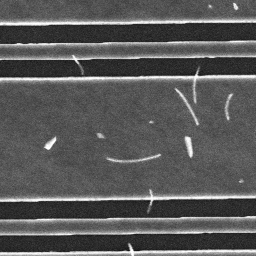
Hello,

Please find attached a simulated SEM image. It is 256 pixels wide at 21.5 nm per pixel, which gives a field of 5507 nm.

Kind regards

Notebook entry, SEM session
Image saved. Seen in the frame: lines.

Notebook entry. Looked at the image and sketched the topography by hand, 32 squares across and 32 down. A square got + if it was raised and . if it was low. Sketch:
++++++++++++++++++++++++++++++++
++++++++++++++++++++++++++++++++
++++++++++++++++++++++++++++++++
................................
................................
..++++++++++++++++++++++++++++++
++++++++++++++++++++++++++++++++
.........+......................
................................
........................+.......
++++++++++++++++++++++++++++++++
++++++++++++++++++++++++++++++++
++++++++++++++++++++++++++++++++
++++++++++++++++++++++++++++++++
++++++++++++++++++++++++++++++++
++++++++++++++++++++++++++++++++
++++++++++++++++++++++++++++++++
++++++++++++++++++++++++++++++++
++++++++++++++++++++++++++++++++
++++++++++++++++++++++++++++++++
++++++++++++++++++++++++++++++++
++++++++++++++++++++++++++++++++
++++++++++++++++++++++++++++++++
++++++++++++++++++++++++++++++++
++++++++++++++++++++++++++++++++
................................
................................
....++++++++++++++++++++++++++++
++++++++++++++++++++++++++++++++
................................
................................
...........+++++++++++++++++++++